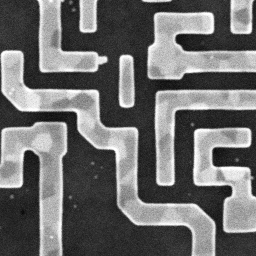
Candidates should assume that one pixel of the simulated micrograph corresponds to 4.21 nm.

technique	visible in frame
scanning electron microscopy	wiring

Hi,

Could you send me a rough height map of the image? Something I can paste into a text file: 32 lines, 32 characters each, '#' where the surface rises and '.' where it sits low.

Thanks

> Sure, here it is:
.....##...##.................###
.....##...##.................##.
.....##...##.......########..##.
.....###..##.......########..##.
.....###...........###..........
.....###...........###..........
.#...###...........#####..###.##
###..#######...##..#############
###..#######...##..#############
###............##..####.........
###............##...............
############...##...############
.###########...##...############
..##########........############
..........##.......###..........
....####..###......###..........
########..#######..###..#######.
########...######...##..#######.
########....#####...##..###.....
###..###......###...##..##......
###..###.......##...##..###.....
###..###.......##...##..#######.
###..###.......##...##..#######.
.....###.......##............##.
.....###.......##............###
.....###.......####.........####
.....###.......##########...####
.....###........###########.####
.....###................###.####
.....###................###.....
.....###................###.....
.....###................###.....